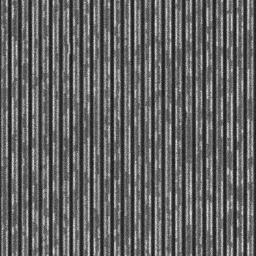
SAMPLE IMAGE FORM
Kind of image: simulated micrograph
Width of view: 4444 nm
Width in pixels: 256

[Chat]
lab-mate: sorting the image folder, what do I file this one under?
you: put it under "parallel lines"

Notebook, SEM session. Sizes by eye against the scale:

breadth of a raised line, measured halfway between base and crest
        102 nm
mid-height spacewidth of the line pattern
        0.0846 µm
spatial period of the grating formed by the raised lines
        178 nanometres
